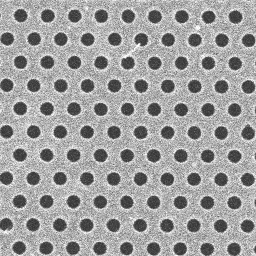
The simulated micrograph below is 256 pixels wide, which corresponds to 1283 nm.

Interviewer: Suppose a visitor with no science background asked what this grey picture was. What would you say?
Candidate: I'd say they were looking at a regular array of holes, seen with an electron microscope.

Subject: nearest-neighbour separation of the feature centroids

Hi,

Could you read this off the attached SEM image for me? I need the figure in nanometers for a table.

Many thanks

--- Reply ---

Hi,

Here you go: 133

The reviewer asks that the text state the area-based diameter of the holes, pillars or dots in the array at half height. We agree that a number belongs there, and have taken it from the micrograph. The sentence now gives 66.9 nanometers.